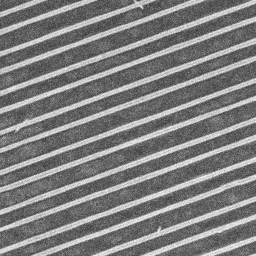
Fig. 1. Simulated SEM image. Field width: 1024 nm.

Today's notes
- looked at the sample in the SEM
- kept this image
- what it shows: parallel lines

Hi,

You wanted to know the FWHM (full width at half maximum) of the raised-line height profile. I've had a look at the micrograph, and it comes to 14.1 nanometres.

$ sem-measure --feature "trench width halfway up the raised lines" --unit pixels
14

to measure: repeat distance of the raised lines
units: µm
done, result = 0.0743